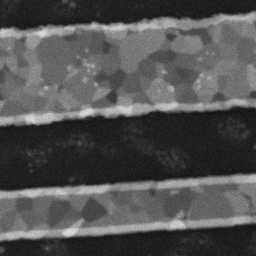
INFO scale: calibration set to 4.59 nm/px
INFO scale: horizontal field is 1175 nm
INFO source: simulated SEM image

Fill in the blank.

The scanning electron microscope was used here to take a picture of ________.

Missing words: one or a few lines or trenches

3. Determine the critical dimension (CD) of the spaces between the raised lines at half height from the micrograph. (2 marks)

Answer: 0.349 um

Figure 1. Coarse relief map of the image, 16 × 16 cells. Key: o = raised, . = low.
................
............oooo
oooooooooooooooo
oooooooooooooooo
oooooooooooooooo
oooooooooooooooo
ooooooooooooooo.
o...............
................
................
................
...........ooooo
oooooooooooooooo
oooooooooooooooo
oooo............
................